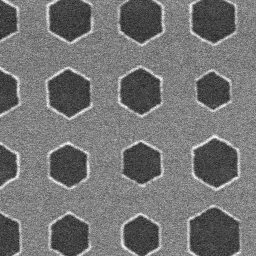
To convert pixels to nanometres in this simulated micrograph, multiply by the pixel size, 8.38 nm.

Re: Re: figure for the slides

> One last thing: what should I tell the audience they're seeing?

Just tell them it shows holes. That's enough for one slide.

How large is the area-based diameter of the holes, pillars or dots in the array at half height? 0.365 µm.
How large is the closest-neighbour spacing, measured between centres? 605 nm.